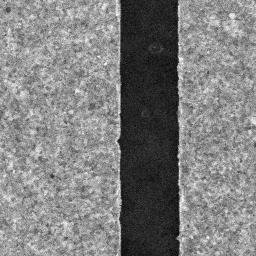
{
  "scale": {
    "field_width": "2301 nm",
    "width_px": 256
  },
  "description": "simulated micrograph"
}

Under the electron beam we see one or a few lines or trenches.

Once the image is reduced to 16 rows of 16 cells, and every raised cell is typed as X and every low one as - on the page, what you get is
XXXXXXX----XXXXX
XXXXXXX----XXXXX
XXXXXXX----XXXXX
XXXXXXX----XXXXX
XXXXXXX----XXXXX
XXXXXXX----XXXXX
XXXXXXX----XXXXX
XXXXXXX----XXXXX
XXXXXXX----XXXXX
XXXXXXX----XXXXX
XXXXXXX----XXXXX
XXXXXXXX---XXXXX
XXXXXXXX---XXXXX
XXXXXXX----XXXXX
XXXXXXX----XXXXX
XXXXXXXX---XXXXX